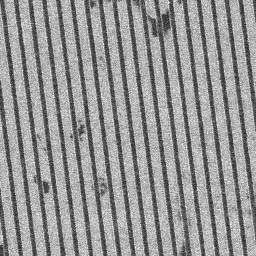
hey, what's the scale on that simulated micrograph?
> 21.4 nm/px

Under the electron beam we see parallel lines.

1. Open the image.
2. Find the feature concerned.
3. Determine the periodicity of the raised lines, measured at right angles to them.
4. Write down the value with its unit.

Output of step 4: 0.299 microns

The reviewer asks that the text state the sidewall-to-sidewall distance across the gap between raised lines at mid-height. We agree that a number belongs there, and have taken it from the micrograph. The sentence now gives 0.17 micrometres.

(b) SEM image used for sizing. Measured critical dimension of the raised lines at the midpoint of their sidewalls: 130 nm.